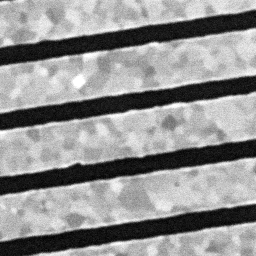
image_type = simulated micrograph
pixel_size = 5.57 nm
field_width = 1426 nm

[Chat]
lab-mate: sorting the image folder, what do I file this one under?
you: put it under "parallel lines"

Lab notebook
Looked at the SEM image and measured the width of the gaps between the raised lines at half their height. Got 110 nm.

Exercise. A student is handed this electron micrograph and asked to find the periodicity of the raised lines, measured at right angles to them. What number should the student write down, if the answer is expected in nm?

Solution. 356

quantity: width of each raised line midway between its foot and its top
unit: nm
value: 247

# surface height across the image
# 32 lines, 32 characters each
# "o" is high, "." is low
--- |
oooooooooooooooooooooooooooooooo
oooooooooooooooooooooooooooooo..
oooooooooooooooooooooooo........
oooooooooooooooo................
oooooooooo.................ooooo
oo.................ooooooooooooo
.............ooooooooooooooooooo
......oooooooooooooooooooooooooo
oooooooooooooooooooooooooooooooo
ooooooooooooooooooooooooooooooo.
ooooooooooooooooooooooo.........
oooooooooooooooo................
oooooooooo.................ooooo
ooo................ooooooooooooo
.............ooooooooooooooooooo
......oooooooooooooooooooooooooo
oooooooooooooooooooooooooooooooo
ooooooooooooooooooooooooooooooo.
ooooooooooooooooooooooo.........
oooooooooooooooooo..............
ooooooooo..................ooooo
ooooo...............oooooooooooo
..............oooooooooooooooooo
.......ooooooooooooooooooooooooo
.ooooooooooooooooooooooooooooooo
oooooooooooooooooooooooooooooo..
oooooooooooooooooooooooo........
oooooooooooooooooo..............
oooooooooo.................ooooo
oooo.................ooooooooooo
..............oooooooooooooooooo
........oooooooooooooooooooooooo